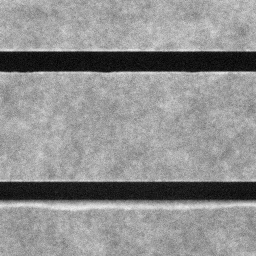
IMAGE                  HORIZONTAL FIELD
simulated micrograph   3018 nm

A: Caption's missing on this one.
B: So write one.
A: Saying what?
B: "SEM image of lines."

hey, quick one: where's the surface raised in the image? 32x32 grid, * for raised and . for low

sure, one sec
********************************
********************************
********************************
********************************
********************************
********************************
................................
................................
................................
********************************
********************************
********************************
********************************
********************************
********************************
********************************
********************************
********************************
********************************
********************************
********************************
********************************
********************************
................................
................................
********************************
********************************
********************************
********************************
********************************
********************************
********************************